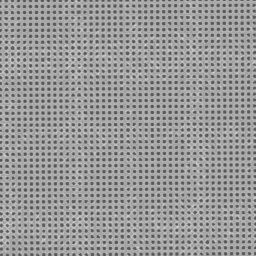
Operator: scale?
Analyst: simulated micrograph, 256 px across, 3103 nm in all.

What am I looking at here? a regular array of holes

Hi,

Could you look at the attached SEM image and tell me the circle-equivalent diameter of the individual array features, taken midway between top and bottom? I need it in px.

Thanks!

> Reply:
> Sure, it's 3.74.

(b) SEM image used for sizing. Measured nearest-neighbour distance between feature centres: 71.1 nanometres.